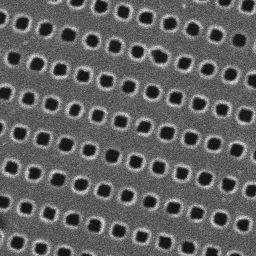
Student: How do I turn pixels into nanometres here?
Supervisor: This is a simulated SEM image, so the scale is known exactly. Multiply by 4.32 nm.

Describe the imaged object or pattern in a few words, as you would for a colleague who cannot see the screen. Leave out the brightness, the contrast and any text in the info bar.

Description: a regular array of holes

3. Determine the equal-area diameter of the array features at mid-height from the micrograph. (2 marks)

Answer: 55.5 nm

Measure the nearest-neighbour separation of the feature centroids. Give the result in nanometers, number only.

102